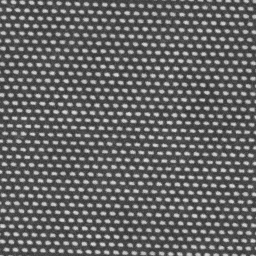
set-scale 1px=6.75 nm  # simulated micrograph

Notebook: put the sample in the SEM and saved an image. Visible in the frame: a regular array of raised bodies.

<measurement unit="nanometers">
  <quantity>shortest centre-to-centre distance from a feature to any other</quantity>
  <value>58.5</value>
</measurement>